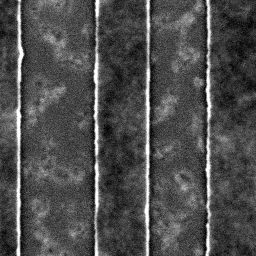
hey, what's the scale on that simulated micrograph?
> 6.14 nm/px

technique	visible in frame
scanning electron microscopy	one or a few lines or trenches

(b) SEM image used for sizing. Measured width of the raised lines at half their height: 322 nm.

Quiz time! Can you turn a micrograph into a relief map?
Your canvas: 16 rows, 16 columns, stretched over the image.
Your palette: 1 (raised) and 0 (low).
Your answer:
1000001110000111
1000001110000111
1000001110000111
1000001110000111
1000001110000111
1000001110000111
1000001110000111
1000001110000111
1000001110000111
1000001110000111
1000001110000111
1000001110000111
1000001110000111
1000001110000111
1000001110000111
1000001110000111